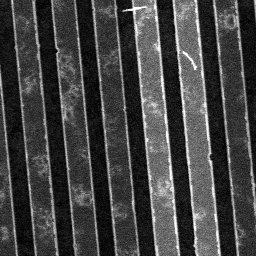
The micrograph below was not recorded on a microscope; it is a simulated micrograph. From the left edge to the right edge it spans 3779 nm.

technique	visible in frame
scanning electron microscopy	parallel lines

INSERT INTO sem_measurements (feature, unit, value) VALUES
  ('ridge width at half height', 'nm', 341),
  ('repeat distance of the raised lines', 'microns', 0.594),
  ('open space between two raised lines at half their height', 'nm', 259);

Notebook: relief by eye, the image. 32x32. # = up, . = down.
..##...##...##...##...###..###..
..##...###..##...###..###..###..
..##...###..###..###..###..###..
..###..###..###..###..###..###..
..###..###..###..###..###..###..
..###..###..###..###..###..###..
..###..###..###..###..###..###..
..###..###..###..###..###..###..
..###..###..###..###..###..###..
..###..###..###..###..###...##..
..###..###..###...##...###..###.
...##...##...##...###..###..###.
...##...###..##...###..###..###.
...##...###..###..###..###..###.
...###..###..###..###..###..###.
#..###..###..###..###..###..###.
#..###..###..###..###..###..###.
#..###..###..###..###..###..###.
#..###..###..###..###..###..###.
#..###..###..###..###..###..###.
#..###..###..###..###..###...##.
#...##...##..###...##...###..###
#...##...##...##...###..###..###
#...##...###..###..###..###..###
#...###..###..###..###..###..###
##..###..###..###..###..###..###
##..###..###..###..###..###..###
##..###..###..###..###..###..###
##..###..###..###..###..###..###
##..###..###..###..###..###..###
##..###..###..###..###..###...##
##..###..###..###...##..###...##